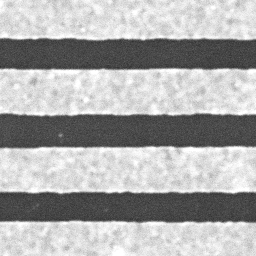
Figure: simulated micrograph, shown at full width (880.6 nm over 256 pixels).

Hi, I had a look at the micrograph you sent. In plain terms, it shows lines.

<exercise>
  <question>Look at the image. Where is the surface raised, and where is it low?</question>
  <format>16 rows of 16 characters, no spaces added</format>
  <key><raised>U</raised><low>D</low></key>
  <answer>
UUUUUUUUUUUUUUUU
UUUUUUUUUUUUUUUU
DDDDDDDDDDDDDDDD
DDDDDDDDDDDDDDDD
UUUUUUUUUUUUUUUU
UUUUUUUUUUUUUUUU
UUUUUUUUUUUUUUUU
DDDDDDDDDDDDDDDD
DDDDDDDDDDDDDDDD
UUUUUUUUUUUUUUUU
UUUUUUUUUUUUUUUU
UUUUUUUUUUUUUUUU
DDDDDDDDDDDDDDDD
DDDDDDDDDDDDDDDD
UUUUUUUUUUUUUUUU
UUUUUUUUUUUUUUUU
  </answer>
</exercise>